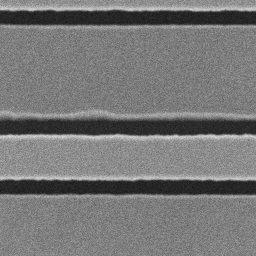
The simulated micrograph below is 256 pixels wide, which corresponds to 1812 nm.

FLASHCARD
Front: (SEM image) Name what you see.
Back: lines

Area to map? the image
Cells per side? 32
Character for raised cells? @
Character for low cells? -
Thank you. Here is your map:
@@@@@@@@@@@@@@@@@@@@@@@@@@@@@@@@
--------------------------------
--------------------------------
@@@@@@@@@@@@@@@@@@@@@@@@@@@@@@@@
@@@@@@@@@@@@@@@@@@@@@@@@@@@@@@@@
@@@@@@@@@@@@@@@@@@@@@@@@@@@@@@@@
@@@@@@@@@@@@@@@@@@@@@@@@@@@@@@@@
@@@@@@@@@@@@@@@@@@@@@@@@@@@@@@@@
@@@@@@@@@@@@@@@@@@@@@@@@@@@@@@@@
@@@@@@@@@@@@@@@@@@@@@@@@@@@@@@@@
@@@@@@@@@@@@@@@@@@@@@@@@@@@@@@@@
@@@@@@@@@@@@@@@@@@@@@@@@@@@@@@@@
@@@@@@@@@@@@@@@@@@@@@@@@@@@@@@@@
@@@@@@@@@@@@@@@@@@@@@@@@@@@@@@@@
@@@@@@@@@@@@@@@@@@@@@@@@@@@@@@@@
--------------------------------
--------------------------------
@@@@@@@@@@@@@@@@@@@@@@@@@@@@@@@@
@@@@@@@@@@@@@@@@@@@@@@@@@@@@@@@@
@@@@@@@@@@@@@@@@@@@@@@@@@@@@@@@@
@@@@@@@@@@@@@@@@@@@@@@@@@@@@@@@@
@@@@@@@@@@@@@@@@@@@@@@@@@@@@@@@@
----------------@----------@--@-
--------------------------------
@@@@@@@@@@@@@@@@@@@@@@@@@@@@@@@@
@@@@@@@@@@@@@@@@@@@@@@@@@@@@@@@@
@@@@@@@@@@@@@@@@@@@@@@@@@@@@@@@@
@@@@@@@@@@@@@@@@@@@@@@@@@@@@@@@@
@@@@@@@@@@@@@@@@@@@@@@@@@@@@@@@@
@@@@@@@@@@@@@@@@@@@@@@@@@@@@@@@@
@@@@@@@@@@@@@@@@@@@@@@@@@@@@@@@@
@@@@@@@@@@@@@@@@@@@@@@@@@@@@@@@@